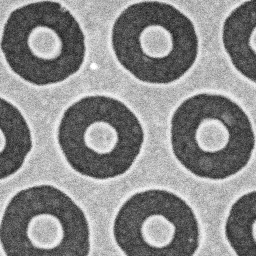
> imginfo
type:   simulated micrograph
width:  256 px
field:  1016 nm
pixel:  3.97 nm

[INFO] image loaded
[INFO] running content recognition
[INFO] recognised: ring-shaped grooves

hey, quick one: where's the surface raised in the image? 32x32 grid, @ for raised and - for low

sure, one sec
@@@----@@@@@@@@@@----@@@@@@@@@--
@@-------@@@@@@--------@@@@@@---
@---------@@@@----------@@@@----
-----@----@@@@-----@----@@@@----
----@@@----@@@----@@@----@@@---@
----@@@@---@@@----@@@----@@@---@
----@@@----@@@----@@@----@@@----
@----------@@@@---------@@@@@---
@---------@@@@@@--------@@@@@---
@@-------@@@@@@@@------@@@@@@@--
@@@@--@@@@@@@@@@@@@@@@@@@@@@@@@@
@@@@@@@@@@@@@@@@@@@@@@@@@@@@@@@@
-@@@@@@@@@-----@@@@@@@@------@@@
--@@@@@@--------@@@@@@--------@@
---@@@@@---------@@@@@---------@
---@@@@-----@-----@@@----@@@---@
----@@@----@@@@---@@@----@@@----
@---@@@----@@@@---@@@----@@@----
----@@@@---@@@----@@@----@@@----
---@@@@@---------@@@@@---------@
---@@@@@@--------@@@@@@--------@
--@@@@@@@@------@@@@@@@@------@@
@@@@@@@@@@@@@@@@@@@@@@@@@@@@@@@@
@@@@---@@@@@@@@@@@@@@@@@@@@@@@@@
@@-------@@@@@@@------@@@@@@@@--
@--------@@@@@@--------@@@@@@---
----------@@@@@---------@@@@@---
----@@@----@@@----@@@----@@@----
----@@@@---@@@----@@@@---@@@----
----@@@@---@@@----@@@@---@@@----
----@@@----@@@@----@@----@@@@---
@----------@@@@---------@@@@@---